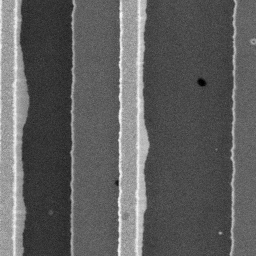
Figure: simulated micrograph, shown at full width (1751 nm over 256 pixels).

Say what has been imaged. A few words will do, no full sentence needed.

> lines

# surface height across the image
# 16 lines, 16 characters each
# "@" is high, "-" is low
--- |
@----@@@@------@
@---@@@@@------@
@----@@@@------@
@----@@@@------@
@----@@@@------@
@---@@@@@------@
@---@@@@@------@
@---@@@@@------@
@---@@@@@------@
@---@@@@@------@
@---@@@@@------@
@---@@@@@------@
@---@@@@@------@
@---@@@@@------@
@---@@@@@-----@@
@---@@@@@-----@@